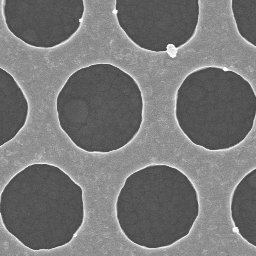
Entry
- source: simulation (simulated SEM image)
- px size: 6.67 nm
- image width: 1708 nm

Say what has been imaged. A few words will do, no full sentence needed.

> holes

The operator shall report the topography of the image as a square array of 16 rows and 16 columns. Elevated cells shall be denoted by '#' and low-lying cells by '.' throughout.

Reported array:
.....##.....###.
.....##.....###.
#...####....###.
################
#####...####...#
.###.....##.....
..##.....##.....
..##.....##.....
.###....####...#
################
##..#####..#####
#....###....###.
.....##.....###.
.....##.....###.
#....###....###.
##.#############